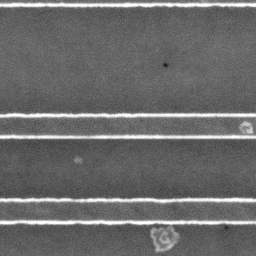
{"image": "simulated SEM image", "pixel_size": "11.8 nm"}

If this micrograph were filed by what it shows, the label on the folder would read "lines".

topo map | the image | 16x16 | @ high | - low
----------------
----------------
----------------
----------------
----------------
----------------
----------------
@@@@@@@@@@@@@@@@
@@@@@@@@@@@@@@@@
----------------
----------------
----------------
@@@@@@@@@@@@@@@@
@@@@@@@@@@@@@@@@
----------------
----------------